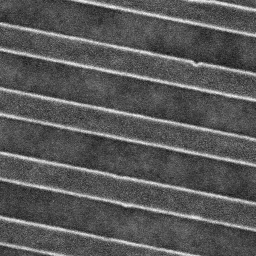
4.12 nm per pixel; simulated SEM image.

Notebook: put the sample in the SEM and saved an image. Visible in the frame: parallel lines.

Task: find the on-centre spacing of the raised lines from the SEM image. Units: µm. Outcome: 0.262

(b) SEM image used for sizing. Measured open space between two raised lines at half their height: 152 nm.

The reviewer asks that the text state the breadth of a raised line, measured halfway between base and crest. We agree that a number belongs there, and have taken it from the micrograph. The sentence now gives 110 nanometres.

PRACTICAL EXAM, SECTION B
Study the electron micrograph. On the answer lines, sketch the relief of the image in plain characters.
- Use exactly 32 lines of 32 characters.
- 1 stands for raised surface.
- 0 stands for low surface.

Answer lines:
00000000000011111111111111111000
00000000000000000111111111111111
00000000000000000000001111111111
11100000000000000000000000011111
11111111000000000000000000000000
11111111111110000000000000000000
01111111111111111100000000000000
00000011111111111111111000000000
00000000000111111111111111110000
00000000000000001111111111111111
00000000000000000000011111111111
11100000000000000000000000111111
11111110000000000000000000000001
11111111111110000000000000000000
01111111111111111100000000000000
00000011111111111111111000000000
00000000000111111111111111110000
00000000000000001111111111111111
00000000000000000000011111111111
11000000000000000000000000111111
11111110000000000000000000000001
11111111111100000000000000000000
01111111111111111000000000000000
00000111111111111111110000000000
00000000001111111111111111110000
00000000000000011111111111111111
00000000000000000000111111111111
11000000000000000000000001111111
11111110000000000000000000000011
11111111111100000000000000000000
11111111111111111000000000000000
00000111111111111111110000000000